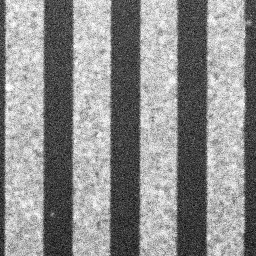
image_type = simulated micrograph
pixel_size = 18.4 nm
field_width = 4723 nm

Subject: one or a few lines or trenches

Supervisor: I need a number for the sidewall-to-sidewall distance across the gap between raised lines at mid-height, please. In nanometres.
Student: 565